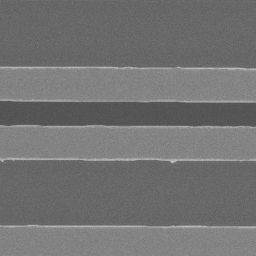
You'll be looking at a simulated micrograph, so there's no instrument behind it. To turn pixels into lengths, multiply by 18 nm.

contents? lines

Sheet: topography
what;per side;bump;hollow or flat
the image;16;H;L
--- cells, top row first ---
LLLLLLLLLLLLLLLL
LLLLLLLLLLLLLLLL
LLLLLLLLLLLLLLLL
LLLLLLLLLLLLLLLL
HHHHHHHHHHHHHHHH
HHHHHHHHHHHHHHHH
LLLLLLLLLLLLLLLL
LLLLLLLLLLLLLLLL
HHHHHHHHHHHHHHHH
HHHHHHHHHHHHHHHH
LLLLLLLLLLLLLLLL
LLLLLLLLLLLLLLLL
LLLLLLLLLLLLLLLL
LLLLLLLLLLLLLLLL
HHHHHHHHHHHHHHHH
HHHHHHHHHHHHHHHH